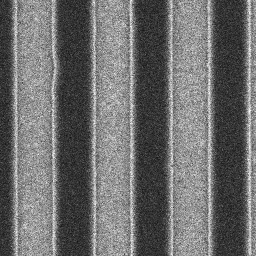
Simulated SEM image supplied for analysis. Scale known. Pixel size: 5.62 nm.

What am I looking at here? one or a few lines or trenches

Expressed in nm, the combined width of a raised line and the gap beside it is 436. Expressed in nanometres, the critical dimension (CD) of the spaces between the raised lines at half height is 203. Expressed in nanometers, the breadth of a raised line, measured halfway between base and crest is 232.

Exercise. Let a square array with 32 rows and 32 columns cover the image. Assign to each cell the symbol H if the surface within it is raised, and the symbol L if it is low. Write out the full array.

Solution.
HHLLLLLHHHHHLLLLHHHHHLLLLLHHHHHL
HHLLLLLHHHHHLLLLHHHHHLLLLLHHHHHL
HHLLLLLHHHHHLLLLHHHHHLLLLLHHHHHL
HHLLLLLHHHHHLLLLHHHHHLLLLLHHHHHL
HHLLLLLHHHHHLLLLHHHHHLLLLLHHHHHL
HHLLLLLHHHHHLLLLHHHHHLLLLLHHHHHL
HHLLLLLHHHHHLLLLHHHHHLLLLLHHHHHL
HHLLLLLHHHHHLLLLHHHHHLLLLLHHHHHL
HHLLLLLHHHHHLLLLHHHHHLLLLLHHHHHL
HHLLLLLHHHHHLLLLHHHHHLLLLLHHHHHL
HHLLLLLHHHHHLLLLHHHHHLLLLLHHHHHL
HHLLLLLHHHHHLLLLHHHHHLLLLLHHHHHL
HHLLLLLHHHHHLLLLHHHHHLLLLLHHHHHL
HHLLLLLHHHHHLLLLHHHHHLLLLLHHHHHL
HHLLLLLHHHHHLLLLHHHHHLLLLLHHHHHL
HHLLLLLHHHHHLLLLHHHHHLLLLLHHHHHL
HHLLLLLHHHHHLLLLHHHHHLLLLLHHHHHL
HHLLLLLHHHHHLLLLHHHHHLLLLLHHHHHL
HHLLLLLHHHHHLLLLHHHHHLLLLLHHHHHL
HHLLLLLHHHHHLLLLHHHHHLLLLLHHHHHL
HHLLLLLHHHHHLLLLHHHHHLLLLLHHHHHL
HHLLLLLHHHHHLLLLHHHHHHLLLLHHHHHL
HHLLLLLHHHHHLLLLHHHHHLLLLLHHHHHL
HHLLLLLHHHHHLLLLHHHHHLLLLLHHHHHL
HHLLLLLHHHHHLLLLHHHHHLLLLLHHHHHL
HHLLLLLHHHHHLLLLHHHHHLLLLLHHHHHL
HHLLLLLHHHHHLLLLHHHHHLLLLLHHHHHL
HHLLLLLHHHHHLLLLHHHHHLLLLLHHHHHL
HHLLLLLHHHHHLLLLLHHHHLLLLLHHHHHL
HHLLLLLHHHHHLLLLHHHHHLLLLLHHHHHL
HHLLLLLHHHHHLLLLHHHHHLLLLLHHHHHL
HHLLLLLHHHHHLLLLHHHHHLLLLLHHHHHL